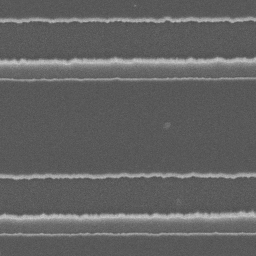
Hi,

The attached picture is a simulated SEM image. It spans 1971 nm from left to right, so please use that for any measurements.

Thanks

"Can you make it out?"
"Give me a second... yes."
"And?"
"lines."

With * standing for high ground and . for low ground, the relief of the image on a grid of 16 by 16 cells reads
****************
................
................
................
****************
****************
****************
****************
****************
****************
****************
................
................
..............**
****************
****************